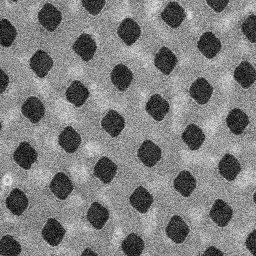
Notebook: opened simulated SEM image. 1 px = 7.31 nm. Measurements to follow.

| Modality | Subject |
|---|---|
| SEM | a regular array of raised bodies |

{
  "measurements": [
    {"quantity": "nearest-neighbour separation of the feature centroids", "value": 0.34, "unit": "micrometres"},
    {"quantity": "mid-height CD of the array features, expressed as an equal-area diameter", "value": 190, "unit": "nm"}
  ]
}